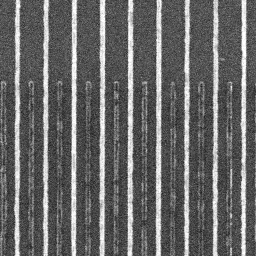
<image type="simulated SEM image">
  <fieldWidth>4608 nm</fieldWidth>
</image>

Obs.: parallel lines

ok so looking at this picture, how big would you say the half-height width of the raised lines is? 0.0585 um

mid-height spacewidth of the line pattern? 191 nm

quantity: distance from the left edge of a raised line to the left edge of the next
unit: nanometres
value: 254